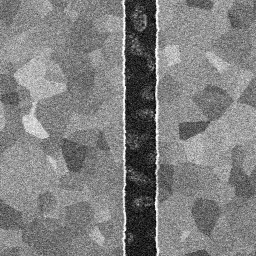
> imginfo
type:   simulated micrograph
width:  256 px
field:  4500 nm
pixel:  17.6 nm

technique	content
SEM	one or a few lines or trenches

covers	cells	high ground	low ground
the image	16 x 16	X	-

XXXXXXXX--XXXXXX
XXXXXXXX--XXXXXX
XXXXXXXX--XXXXXX
XXXXXXXX--XXXXXX
XXXXXXXX--XXXXXX
XXXXXXXX--XXXXXX
XXXXXXXX--XXXXXX
XXXXXXXX--XXXXXX
XXXXXXXX--XXXXXX
XXXXXXXX--XXXXXX
XXXXXXXX--XXXXXX
XXXXXXXX--XXXXXX
XXXXXXXX--XXXXXX
XXXXXXXX--XXXXXX
XXXXXXXX--XXXXXX
XXXXXXXX--XXXXXX